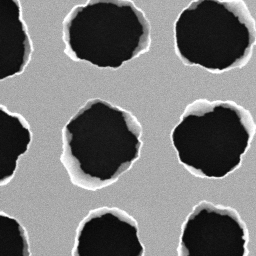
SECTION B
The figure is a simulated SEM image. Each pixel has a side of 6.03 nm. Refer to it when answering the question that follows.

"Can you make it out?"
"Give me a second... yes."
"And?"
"holes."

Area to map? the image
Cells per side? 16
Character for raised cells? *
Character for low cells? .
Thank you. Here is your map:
.****....***...*
.***.....**....*
..**.....**.....
..***...***....*
.***************
****************
*****..*********
.***....***....*
..**.....**....*
.***.....**....*
.****...****...*
****************
****************
******.*****...*
.****....**....*
..***....**....*